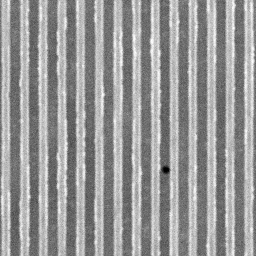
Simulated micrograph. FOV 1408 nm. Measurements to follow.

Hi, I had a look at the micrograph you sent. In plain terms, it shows parallel lines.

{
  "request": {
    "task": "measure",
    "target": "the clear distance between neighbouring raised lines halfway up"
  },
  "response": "58.4 nanometres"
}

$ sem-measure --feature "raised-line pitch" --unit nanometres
103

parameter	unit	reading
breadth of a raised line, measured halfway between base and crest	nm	42.6